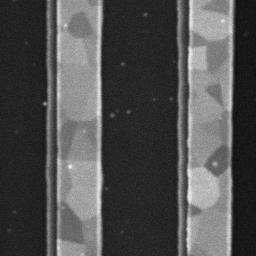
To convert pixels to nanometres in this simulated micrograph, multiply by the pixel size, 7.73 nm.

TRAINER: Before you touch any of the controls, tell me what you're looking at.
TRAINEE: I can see lines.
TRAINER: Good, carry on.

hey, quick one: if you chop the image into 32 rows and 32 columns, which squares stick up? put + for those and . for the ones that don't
.......+++++............+++++...
.......+++++............+++++...
.......+++++............+++++...
.......+++++............+++++...
.......+++++............+++++...
.......+++++............+++++...
.......+++++............+++++...
.......+++++............+++++...
.......+++++............+++++...
.......+++++............+++++...
.......+++++............+++++...
.......+++++............+++++...
.......+++++............+++++...
.......+++++............+++++...
.......+++++............+++++...
.......+++++............+++++...
.......+++++............+++++...
.......+++++............+++++...
.......+++++............+++++...
.......+++++............+++++...
.......+++++............+++++...
.......+++++............+++++...
.......+++++............+++++...
.......+++++............+++++...
.......+++++............+++++...
.......+++++............+++++...
.......+++++............+++++...
.......+++++............+++++...
.......+++++...........++++++...
.......+++++...........++++++...
.......+++++...........++++++...
.......+++++............+++++...